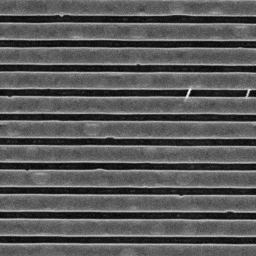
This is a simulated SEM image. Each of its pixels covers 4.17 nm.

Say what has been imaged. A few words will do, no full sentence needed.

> parallel lines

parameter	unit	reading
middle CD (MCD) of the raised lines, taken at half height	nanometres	71.9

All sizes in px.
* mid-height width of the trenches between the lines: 7.24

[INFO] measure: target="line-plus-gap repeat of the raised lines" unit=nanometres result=102